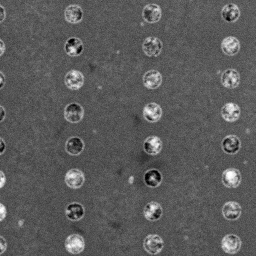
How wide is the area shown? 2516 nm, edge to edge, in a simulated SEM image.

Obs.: a regular array of holes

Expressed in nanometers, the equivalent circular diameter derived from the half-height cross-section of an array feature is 169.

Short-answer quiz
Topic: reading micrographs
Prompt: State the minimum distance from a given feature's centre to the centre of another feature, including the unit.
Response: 322 nanometers